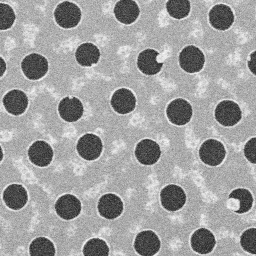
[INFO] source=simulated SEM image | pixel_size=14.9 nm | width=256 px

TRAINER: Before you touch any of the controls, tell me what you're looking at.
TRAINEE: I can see a regular array of holes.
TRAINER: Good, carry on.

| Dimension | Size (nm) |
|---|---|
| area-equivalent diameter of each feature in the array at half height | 401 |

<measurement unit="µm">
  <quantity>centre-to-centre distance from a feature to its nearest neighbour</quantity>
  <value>0.665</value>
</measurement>